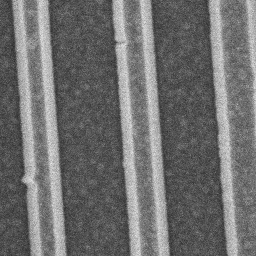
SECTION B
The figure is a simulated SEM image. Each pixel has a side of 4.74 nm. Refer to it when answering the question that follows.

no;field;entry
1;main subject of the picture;one or a few lines or trenches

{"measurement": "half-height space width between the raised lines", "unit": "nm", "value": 328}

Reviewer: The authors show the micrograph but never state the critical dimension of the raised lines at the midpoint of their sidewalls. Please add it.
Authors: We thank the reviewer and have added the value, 29.2 pixels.